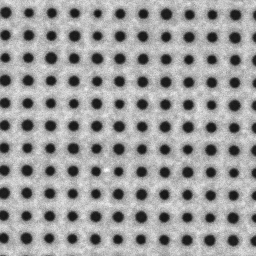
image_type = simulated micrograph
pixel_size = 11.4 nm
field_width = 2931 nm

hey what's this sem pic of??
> a regular array of holes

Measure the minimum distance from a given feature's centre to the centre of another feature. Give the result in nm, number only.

255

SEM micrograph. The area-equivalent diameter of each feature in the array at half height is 0.128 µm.